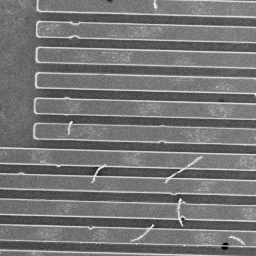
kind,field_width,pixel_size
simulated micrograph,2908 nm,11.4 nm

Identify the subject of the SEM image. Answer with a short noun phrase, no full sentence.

parallel lines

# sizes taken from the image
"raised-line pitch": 290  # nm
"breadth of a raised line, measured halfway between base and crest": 184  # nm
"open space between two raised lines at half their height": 109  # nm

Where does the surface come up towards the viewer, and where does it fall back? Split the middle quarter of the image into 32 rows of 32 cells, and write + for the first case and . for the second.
............................++++
................................
+++++...........................
++++++++++++++++++++++++++++++++
++++++++++++++++++++++++++++++++
++++++++++++++++++++++++++++++++
..........++++++++++++++++++++++
................................
................................
+++++++++++++++++++++++++++..++.
++++++++++++++++++++++++++++++++
++++++++++++++++++++++++++++++++
+.++++++++++++++++++++++++++++++
................................
................................
+++++++++++++++.................
++++++++++++++++++++++++++++++++
++++++++++++++++++++++++++++++++
++++++++++++++++++++++++++++++++
.....................+++.+++++++
................................
+++++++.........................
++++++++++++++++++++++++++++++++
++++++++++++++++++++++++++++++++
++++++++++++++++++++++++++++++++
....++++++++++++++++++++++++++++
........+....................+..
................................
++++++++++++++++++++++++++++....
++++++++++++++++++++++++++++++++
++++++++++++++++++++++++++++++++
++++++++++++++++++++++++++++++++